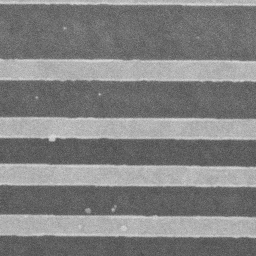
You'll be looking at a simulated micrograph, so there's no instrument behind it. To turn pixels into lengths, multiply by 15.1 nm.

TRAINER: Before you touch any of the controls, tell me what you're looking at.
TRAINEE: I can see lines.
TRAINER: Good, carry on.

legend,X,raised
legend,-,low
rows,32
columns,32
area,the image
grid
-----------------------XXXXXXXXX
--------------------------------
--------------------------------
--------------------------------
--------------------------------
--------------------------------
--------------------------------
--------------------------------
XXXXXXXXXXXXXXXXXXXXXXXXXXXXXXXX
XXXXXXXXXXXXXXXXXXXXXXXXXXXXXXXX
--------------------------------
--------------------------------
--------------------------------
--------------------------------
--------------------------------
XXXXXXXXXXXXXXXXXXXXXXXXXXXXXXXX
XXXXXXXXXXXXXXXXXXXXXXXXXXXXXXXX
------X-------------------------
--------------------------------
--------------------------------
--------------------------------
XXXXXXXXXXXXXXXXXXXXXXXXXXXXXXXX
XXXXXXXXXXXXXXXXXXXXXXXXXXXXXXXX
--------------------------------
--------------------------------
--------------------------------
--------------------------------
XXXXXXXXXXXXXXXXXXXXXXXXXXXXXXXX
XXXXXXXXXXXXXXXXXXXXXXXXXXXXXXXX
-----------------XXXXXXXXXXXXXXX
--------------------------------
--------------------------------